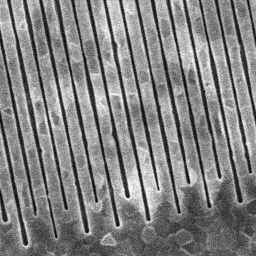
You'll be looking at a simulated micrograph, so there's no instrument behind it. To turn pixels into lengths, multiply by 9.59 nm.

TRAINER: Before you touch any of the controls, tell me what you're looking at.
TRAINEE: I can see parallel lines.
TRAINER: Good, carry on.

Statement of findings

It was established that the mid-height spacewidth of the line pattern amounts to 39.9 nm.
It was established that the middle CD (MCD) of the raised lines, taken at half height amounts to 114 nm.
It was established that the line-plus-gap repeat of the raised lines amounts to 150 nm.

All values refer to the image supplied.